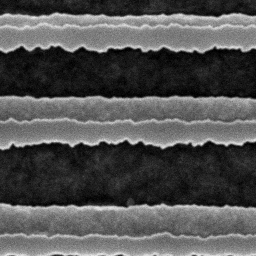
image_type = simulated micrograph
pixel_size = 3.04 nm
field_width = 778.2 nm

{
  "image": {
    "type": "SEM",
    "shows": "lines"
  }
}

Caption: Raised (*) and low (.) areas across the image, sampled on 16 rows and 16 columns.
................
****************
****************
................
................
................
****************
****************
****************
................
................
................
................
****************
****************
****************